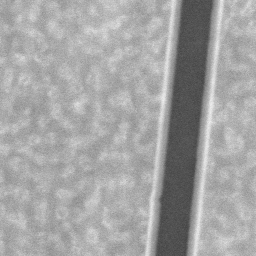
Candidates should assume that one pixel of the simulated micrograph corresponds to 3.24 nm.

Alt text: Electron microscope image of one or a few lines or trenches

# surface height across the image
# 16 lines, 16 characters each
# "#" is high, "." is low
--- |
###########...##
###########..###
###########..###
###########..###
###########..###
##########...###
##########...###
##########...###
##########...###
##########...###
##########...###
##########..####
##########..####
##########..####
##########..####
#########...####